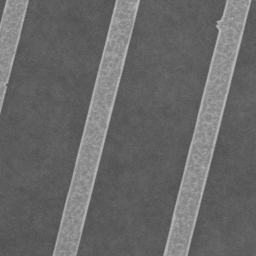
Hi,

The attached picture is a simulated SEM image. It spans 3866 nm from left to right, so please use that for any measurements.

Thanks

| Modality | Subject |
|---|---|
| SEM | one or a few lines or trenches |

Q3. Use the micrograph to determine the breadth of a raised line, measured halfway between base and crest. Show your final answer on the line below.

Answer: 320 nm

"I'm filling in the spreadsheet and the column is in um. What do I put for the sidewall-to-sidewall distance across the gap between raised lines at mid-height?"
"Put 1.3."